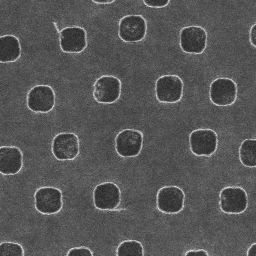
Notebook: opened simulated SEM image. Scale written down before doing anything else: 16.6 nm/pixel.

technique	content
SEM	a regular array of raised bodies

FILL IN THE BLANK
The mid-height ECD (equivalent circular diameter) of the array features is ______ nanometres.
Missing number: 468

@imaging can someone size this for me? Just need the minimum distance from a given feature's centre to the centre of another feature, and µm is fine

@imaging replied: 0.942